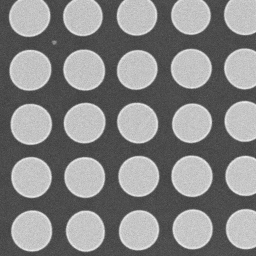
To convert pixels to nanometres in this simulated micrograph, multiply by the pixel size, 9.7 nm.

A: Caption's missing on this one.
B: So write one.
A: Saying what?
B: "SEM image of an array of small figures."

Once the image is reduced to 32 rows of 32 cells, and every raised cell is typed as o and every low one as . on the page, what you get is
..oooo...ooo...oooo...oooo..oooo
.ooooo..ooooo..ooooo.ooooo..oooo
.ooooo..ooooo..ooooo.ooooo..oooo
..oooo..oooo...oooo...oooo...ooo
...o............................
................................
...oo....ooo....oo.....oo....ooo
..oooo..ooooo..oooo...oooo..oooo
.ooooo..ooooo..ooooo.ooooo..oooo
.ooooo..ooooo..oooo...oooo..oooo
..oooo...oooo..oooo...oooo...ooo
................................
................................
..ooo....ooo...oooo...oooo...ooo
..oooo..ooooo..ooooo..oooo..oooo
.ooooo..ooooo..ooooo..oooo..oooo
.ooooo..ooooo..ooooo..oooo...ooo
..oooo...ooo....ooo....oo.....oo
................................
................................
..oooo...ooo...oooo...oooo...ooo
..oooo..ooooo..ooooo..oooo..oooo
..oooo..ooooo..ooooo..ooooo.oooo
..oooo..ooooo..oooo...oooo...ooo
...oo.....oo.....o.....oo.......
................................
...oo.....oo.....o.....oo....ooo
..oooo...oooo..ooooo..oooo...ooo
.ooooo..ooooo..ooooo..oooo..oooo
.ooooo..ooooo..ooooo..oooo..oooo
..oooo...oooo..oooo...oooo...ooo
................................